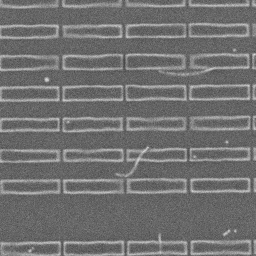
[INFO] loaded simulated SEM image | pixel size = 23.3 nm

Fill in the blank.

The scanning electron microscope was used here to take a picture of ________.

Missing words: wiring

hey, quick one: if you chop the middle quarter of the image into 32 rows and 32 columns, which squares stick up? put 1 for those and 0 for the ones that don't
11111111111111111111111111111100
00000000000000000000000000000000
00000000000000000000000000000000
00000000000000000000000000000000
00000000000000000000000000000000
00000000000000001110000000000000
11111111111111101111111111111100
11111111111111101111111111111100
11111111111111101111111111111100
00000000000000000000000000000000
00000000000000000000000000000000
00000000000000000000000000000000
00000000000000000000000000000000
00000000000000000000000000000000
11111111111111001111111111111100
11111111111111001111111111111100
11111111111001000000000000000000
00000000000000000000000000000000
00000000000000000000000000000000
00000000000000000000000000000000
00000000000000000000000000000000
00000000011111000000110011111100
11111111111111101111111111111100
11111111111111101111111111111110
00000000000000000000000000000000
00000000000000000000000000000000
00000000000000000000000000000000
00000000000000000000000000000000
00000000000000000000000000000000
11111111111111001111111111111100
11111111111111001111111111111100
11111111111111001111111111111100